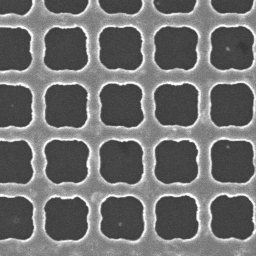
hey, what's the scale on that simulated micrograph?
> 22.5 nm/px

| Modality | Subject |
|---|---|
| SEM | a regular array of holes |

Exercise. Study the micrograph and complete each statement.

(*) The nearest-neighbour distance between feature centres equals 1240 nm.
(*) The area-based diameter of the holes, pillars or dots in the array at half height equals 1.06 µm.